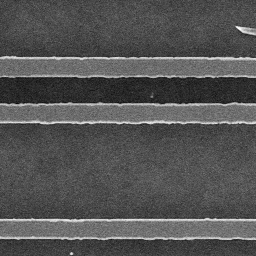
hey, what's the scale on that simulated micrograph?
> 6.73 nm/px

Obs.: lines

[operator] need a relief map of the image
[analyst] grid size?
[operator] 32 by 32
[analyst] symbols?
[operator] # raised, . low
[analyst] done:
................................
................................
................................
................................
................................
................................
................................
################################
################################
################################
................................
................................
................................
################################
################################
................................
................................
................................
................................
................................
................................
................................
................................
................................
................................
................................
................................
######.#...#...#################
################################
################################
................................
................................